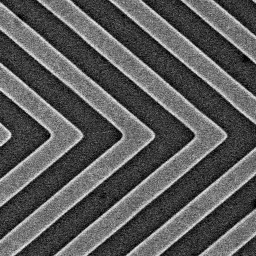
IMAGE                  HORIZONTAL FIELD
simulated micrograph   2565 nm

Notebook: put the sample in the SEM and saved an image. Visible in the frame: groups of lines, slits or small figures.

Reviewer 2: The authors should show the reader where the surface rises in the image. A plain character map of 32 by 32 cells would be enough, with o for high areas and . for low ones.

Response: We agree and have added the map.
.....oooo.....oooo.....oooo.....
o.....oooo.....oooo.....oooo....
ooo.....oooo.....oooo.....ooo...
oooo.....oooo.....oooo.....oooo.
.oooo.....oooo.....oooo.....oooo
..oooo.....oooo.....oooo.....ooo
...oooo.....oooo.....oooo.....oo
.....ooo......ooo.....oooo.....o
o.....oooo.....oooo.....oooo....
oo.....oooo.....oooo.....oooo...
ooo.....oooo.....oooo.....oooo..
oooo.....oooo.....oooo.....oooo.
..ooo......ooo.....oooo.....oooo
...oooo.....oooo.....ooo......oo
....oooo.....oooo.....oooo.....o
.....oooo.....oooo.....oooo.....
o.....oooo.....oooo.....oooo....
o.....oooo.....oooo.....oooo....
.....oooo.....oooo.....oooo.....
....oooo.....oooo.....oooo.....o
..oooo.....oooo.....oooo......oo
.oooo.....oooo.....oooo.....oooo
oooo.....oooo.....oooo.....oooo.
ooo.....oooo.....oooo.....oooo..
oo.....oooo.....oooo.....oooo...
.....oooo.....oooo......ooo.....
....oooo.....oooo.....oooo......
...oooo.....oooo.....oooo.....oo
..oooo.....oooo.....oooo.....ooo
.oooo.....oooo.....oooo.....oooo
ooo......oooo....ooooo.....oooo.
oo.....oooo.....oooo.....oooo...